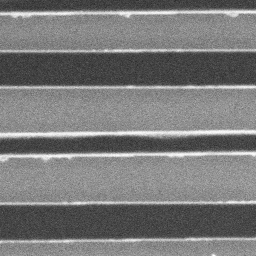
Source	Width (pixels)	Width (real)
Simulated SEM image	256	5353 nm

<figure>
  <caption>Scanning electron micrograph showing lines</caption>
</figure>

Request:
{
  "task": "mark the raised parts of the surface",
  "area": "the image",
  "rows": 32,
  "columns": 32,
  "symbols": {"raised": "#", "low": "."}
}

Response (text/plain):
################################
###############################.
................................
................................
................................
................................
################################
################################
################################
################################
################################
................................
................................
................................
................................
................................
................................
################################
################################
#######.........................
................................
................................
................................
................................
................................
################################
################################
################################
################################
################################
................................
................................